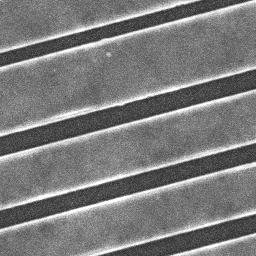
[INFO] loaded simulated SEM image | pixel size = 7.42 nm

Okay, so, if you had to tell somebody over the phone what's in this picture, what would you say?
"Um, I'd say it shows one or a few lines or trenches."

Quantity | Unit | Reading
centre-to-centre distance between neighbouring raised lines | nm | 564